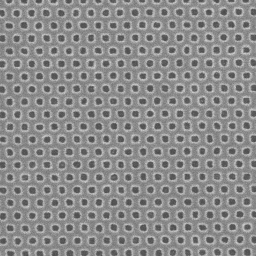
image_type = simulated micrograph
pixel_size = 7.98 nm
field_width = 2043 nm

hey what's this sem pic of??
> a regular array of holes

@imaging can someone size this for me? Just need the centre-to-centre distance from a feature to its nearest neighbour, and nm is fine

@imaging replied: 114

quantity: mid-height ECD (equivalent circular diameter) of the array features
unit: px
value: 7.73